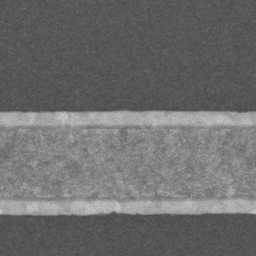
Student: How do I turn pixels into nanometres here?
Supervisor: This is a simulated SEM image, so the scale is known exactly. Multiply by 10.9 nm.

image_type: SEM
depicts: one or a few lines or trenches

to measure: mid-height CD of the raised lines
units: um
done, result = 0.948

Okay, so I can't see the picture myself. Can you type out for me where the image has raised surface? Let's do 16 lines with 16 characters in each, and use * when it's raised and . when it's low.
................
................
................
................
................
................
................
.....*********..
****************
****************
****************
****************
****************
................
................
................